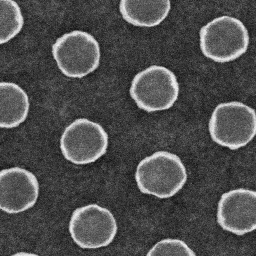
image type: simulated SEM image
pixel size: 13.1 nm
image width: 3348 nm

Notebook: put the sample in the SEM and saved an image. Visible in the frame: raised bodies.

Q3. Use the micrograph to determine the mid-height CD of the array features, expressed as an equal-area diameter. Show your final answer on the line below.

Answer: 581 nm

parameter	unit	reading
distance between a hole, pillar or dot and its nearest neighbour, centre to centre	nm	1120